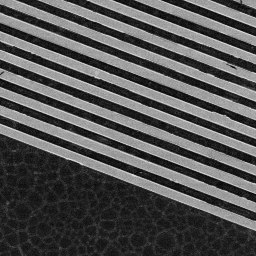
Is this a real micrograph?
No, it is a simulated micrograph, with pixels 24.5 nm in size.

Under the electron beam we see parallel lines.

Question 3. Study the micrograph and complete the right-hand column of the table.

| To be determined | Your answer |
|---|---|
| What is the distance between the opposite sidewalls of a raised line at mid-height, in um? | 0.2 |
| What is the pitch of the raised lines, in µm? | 0.422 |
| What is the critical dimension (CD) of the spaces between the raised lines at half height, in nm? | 220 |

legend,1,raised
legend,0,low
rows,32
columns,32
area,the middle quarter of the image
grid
11111110000011111110000001111110
00011111100000011111100000001111
00000011111000000011111100000011
11000000111111100000111111100000
11111000000111111000000111111000
00111111000000111111000000111111
00001111110000001111110000001111
00000001111110000001111110000001
11100000001111100000001111110000
11111100000011111100000011111100
00011111000000011111000000011111
00000111111000000111111000000111
11000000111111000000111111000000
11110000000111110000000111111000
01111110000001111110000001111110
00001111110000001111110000001111
00000011111100000001111100000001
11100000011111100000011111100000
11111000000111111000000011111000
00111111000000111111000000111111
00001111111000001111111000000111
10000001111110000001111110000000
11110000001111110000001111110000
11111100000011111110000011111110
00011111100000011111100000011111
00000011111100000011111100000011
00000000111111000000111111000000
00000000000111111000000111111000
00000000000001111111000001111111
00000000000000001111110000001111
00000000000000000001111110000001
00000000000000000000011111110000